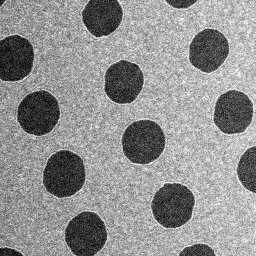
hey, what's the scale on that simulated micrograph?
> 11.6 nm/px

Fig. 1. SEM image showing raised bodies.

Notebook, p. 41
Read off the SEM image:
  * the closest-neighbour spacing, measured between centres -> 0.766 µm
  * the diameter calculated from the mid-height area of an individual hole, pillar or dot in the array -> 526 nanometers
